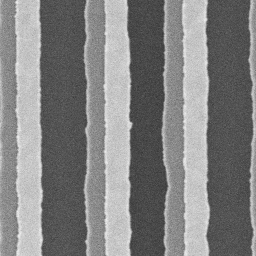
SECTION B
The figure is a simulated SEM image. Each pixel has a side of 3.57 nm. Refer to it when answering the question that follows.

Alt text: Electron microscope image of lines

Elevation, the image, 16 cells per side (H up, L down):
HHLLLHHHLLHHHLLL
HHLLLHHHLLHHHLLL
HHHLLHHHLLHHHLLL
HHHLLHHHLLHHHLLL
HHLLLHHHLLHHHLLL
HHHLLHHHLLHHHLLL
HHHLLHHHLLHHHLLL
HHHLLHHHLLHHHLLL
HHHLLHHHLLHHHLLL
HHHLLHHHLLHHHLLL
HHHLLHHHLLHHHLLL
HHHLLHHHLLHHHLLL
HHHLLHHHLLHHHLLL
HHHLLHHHLLHHHLLL
HHHLLHHHLLHHHLLL
HHHLLHHHLLHHHLLL